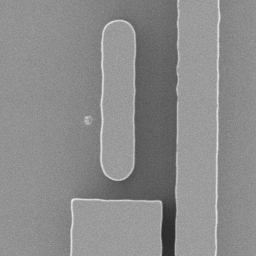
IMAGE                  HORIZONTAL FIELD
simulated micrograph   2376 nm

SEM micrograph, groups of lines, slits or small figures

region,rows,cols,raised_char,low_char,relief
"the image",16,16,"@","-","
-----------@@@--
-------@---@@@--
------@@---@@@--
------@@---@@@--
------@@---@@@--
------@@---@@@--
------@@---@@@--
------@@---@@@--
------@@---@@@--
------@@---@@@--
------@@---@@@--
-----------@@@--
-----@@----@@@--
----@@@@@@-@@@--
----@@@@@@-@@---
----@@@@@@-@@---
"